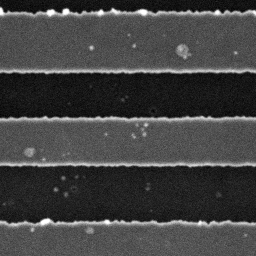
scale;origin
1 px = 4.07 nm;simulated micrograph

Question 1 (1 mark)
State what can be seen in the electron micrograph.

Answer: lines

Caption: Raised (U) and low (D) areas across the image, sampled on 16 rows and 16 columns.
DDDDDDDDDDDDDDDD
UUUUUUUUUUUUUUUU
UUUUUUUUUUUUUUUU
UUUUUUUUUUUUUUUU
UUUUUUUUUUUUDUUU
DDDDDDDDDDDDDDDD
DDDDDDDDDDDDDDDD
UUUUUUUUUUUUUUUU
UUUUUUUUUUUUUUUU
UUUUUUUUUUUUUUUU
DDDDDDDDDDDDDDDD
DDDDDDDDDDDDDDDD
DDDDDDDDDDDDDDDD
DDDDDDDDDDDDDDDD
UUUUUUUUUUUUUUUU
UUUUUUUUUUUUUUUU